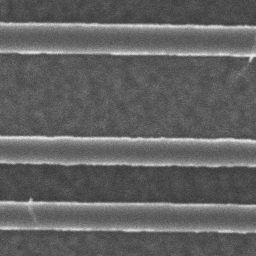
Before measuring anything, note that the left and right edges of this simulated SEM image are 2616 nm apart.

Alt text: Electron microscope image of lines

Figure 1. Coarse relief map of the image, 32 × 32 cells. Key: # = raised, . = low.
................................
................................
................................
################################
################################
################################
################################
................................
................................
................................
................................
................................
................................
................................
................................
................................
................................
########################........
################################
################################
.......#########################
................................
................................
................................
................................
######################..........
################################
################################
################################
................................
................................
................................